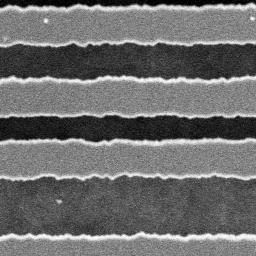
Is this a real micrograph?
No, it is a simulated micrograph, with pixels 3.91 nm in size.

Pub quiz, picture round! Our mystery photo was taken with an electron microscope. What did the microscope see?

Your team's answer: lines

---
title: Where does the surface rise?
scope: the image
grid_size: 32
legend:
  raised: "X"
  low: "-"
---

-------------------------------X
XXXXXXXXXXXXXXXXXXXXXXXXXXXXXXXX
XXXXXXXXXXXXXXXXXXXXXXXXXXXXXXXX
XXXXXXXXXXXXXXXXXXXXXXXXXXXXXXXX
XXXXXXXXXXXXXXXXXXXXXXXXXXXXXXXX
XX-XXXXXXXXXX-X--XX--XXX-XX---X-
--------------------------------
--------------------------------
--------------------------------
-------------X-X----------------
XXXXXXXXXXXXXXXXXXXXXXXXXXXXXXXX
XXXXXXXXXXXXXXXXXXXXXXXXXXXXXXXX
XXXXXXXXXXXXXXXXXXXXXXXXXXXXXXXX
XXXXXXXXXXXXXXXXXXXXXXXXXXXXXXXX
XXXXX--XXX--X--XX-X---XXXXX-X-XX
--------------------------------
--------------------------------
-X--XXX-XXX---XX-----XXXXXXXX-XX
XXXXXXXXXXXXXXXXXXXXXXXXXXXXXXXX
XXXXXXXXXXXXXXXXXXXXXXXXXXXXXXXX
XXXXXXXXXXXXXXXXXXXXXXXXXXXXXXXX
XXXXXXXXXXXXXXXXXXXXXXXXXXXXXXXX
--------------------------------
--------------------------------
--------------------------------
--------------------------------
--------------------------------
--------------------------------
--------------------------------
XXXXXXXXX-X-XXXXXXXXXX-XXXXXXXXX
XXXXXXXXXXXXXXXXXXXXXXXXXXXXXXXX
XXXXXXXXXXXXXXXXXXXXXXXXXXXXXXXX